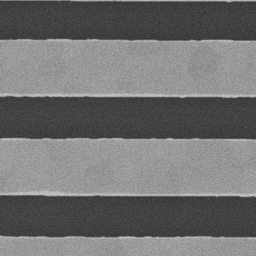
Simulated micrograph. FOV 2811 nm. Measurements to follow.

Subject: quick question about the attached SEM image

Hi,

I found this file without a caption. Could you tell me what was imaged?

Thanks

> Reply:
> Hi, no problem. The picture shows lines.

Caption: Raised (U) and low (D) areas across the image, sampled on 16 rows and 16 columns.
DDDDDDDDDDDDDDDD
DDDDDDDDDDDDDDDD
DUUUUUUDDDDDDDDD
UUUUUUUUUUUUUUUU
UUUUUUUUUUUUUUUU
UUUUUUUUUUUUUUUU
DDDDDDDDDDDDDDDD
DDDDDDDDDDDDDDDD
DDDDDDDDDDDDDDDD
UUUUUUUUUUUUUUUU
UUUUUUUUUUUUUUUU
UUUUUUUUUUUUUUUU
DDDDDDDDDDDDDDDD
DDDDDDDDDDDDDDDD
DDDDDDDDDDDDDDDD
UUUUUUUUUUUUUUUU